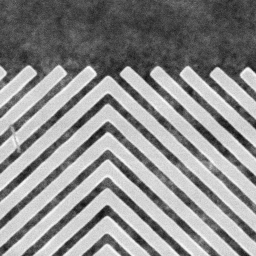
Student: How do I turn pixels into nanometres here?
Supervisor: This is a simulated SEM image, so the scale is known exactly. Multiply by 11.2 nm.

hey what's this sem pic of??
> groups of lines, slits or small figures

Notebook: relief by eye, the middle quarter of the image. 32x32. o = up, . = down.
................................
.....oo........oo.....ooo.....oo
....oooo......oooo....oooo...ooo
...oooo...oo...oooo...ooooo...oo
..oooo...oooo...ooooo..ooooo...o
.oooo...oooooo...oooo...oooo....
oooo...oooooooo...oooo....oooo..
ooo...oooo..oooo...oooo....oooo.
oo...oooo....oooo...oooo....oooo
o...oooo......oooo...ooooo...ooo
...oooo...oo...oooo...oooo....oo
..oooo...oooo...oooo...ooooo...o
ooooo...oooooo...oooo...ooooo...
oooo...oooooooo...oooo...ooooo..
ooo...oooo..oooo...oooo...ooooo.
oo...oooo....oooo...oooo...ooooo
o...oooo......oooo...ooooo..oooo
...oooo........oooo...ooooo...oo
..oooo...oooo...oooo...ooooo...o
.oooo...oooooo...oooo...ooooo...
oooo...oooooooo...oooo...ooooo..
ooo...oooo.ooooo...oooo...ooooo.
oo...oooo...ooooo...oooo...ooooo
o...oooo......oooo...ooooo..oooo
...oooo...oo...oooo...oooo....oo
.ooooo...ooo....oooo...ooooo...o
ooooo...ooooo....oooo...ooooo...
oooo...oooooooo...oooo...ooooo..
ooo...oooo..oooo...oooo...ooooo.
oo...oooo...ooooo...oooo...ooooo
o...oooo......oooo...oooo...oooo
...oooo...oo...oooo...oooo...ooo